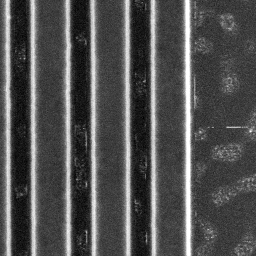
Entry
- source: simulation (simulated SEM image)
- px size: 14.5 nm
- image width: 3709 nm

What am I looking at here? parallel lines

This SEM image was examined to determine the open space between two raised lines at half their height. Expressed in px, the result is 24.3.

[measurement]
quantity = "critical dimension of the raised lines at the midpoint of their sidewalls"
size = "516 nanometers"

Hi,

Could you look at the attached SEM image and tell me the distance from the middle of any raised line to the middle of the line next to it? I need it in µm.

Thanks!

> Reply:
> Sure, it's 0.868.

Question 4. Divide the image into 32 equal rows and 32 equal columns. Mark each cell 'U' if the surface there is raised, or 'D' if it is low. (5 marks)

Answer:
UDDDUUUUDDDDUUUUDDDUUUUDDDDDDDDD
UDDDUUUUDDDDUUUUDDDUUUUDDDDDDDDD
UDDDUUUUDDDDUUUUDDDUUUUDDDDDDDDD
UDDDUUUUDDDDUUUUDDDUUUUDDDDDDDDD
UDDDUUUUDDDDUUUUDDDUUUUDDDDDDDDD
UDDDUUUUUDDDUUUUDDDUUUUDDDDDDDDD
UDDDUUUUUDDDUUUUDDDUUUUDDDDDDDDD
UDDDUUUUUDDDUUUUDDDUUUUDDDDDDDDD
UDDDUUUUUDDDUUUUDDDUUUUDDDDDDDDD
UDDDUUUUDDDDUUUUDDDUUUUDDDDDDDDD
UDDDUUUUDDDDUUUUDDDUUUUDDDDDDDDD
UDDDUUUUDDDDUUUUDDDUUUUDDDDDDDDD
UDDDUUUUDDDDUUUUDDDUUUUDDDDDDDDD
UDDDUUUUDDDDUUUUDDDUUUUDDDDDDDDD
UDDDUUUUDDDDUUUUDDDUUUUDDDDDDDDD
UDDDUUUUUDDDUUUUDDDUUUUDDDDDDDDD
UDDDUUUUUDDDUUUUDDDUUUUDDDDDDDDD
UDDDUUUUUDDDUUUUDDDUUUUDDDDDDDDD
UDDDUUUUUDDDUUUUDDDUUUUDDDDDDDDD
UDDDUUUUUDDDUUUUDDDUUUUDDDDDDDDD
UDDDUUUUUDDDUUUUDDDUUUUDDDDDDDDD
UDDDUUUUUDDDUUUUDDDUUUUDDDDDDDDD
UDDDUUUUUDDDUUUUDDDUUUUUDDDDDDDD
UDDDUUUUUDDDUUUUDDDUUUUUDDDDDDDD
UDDDUUUUUDDDUUUUDDDUUUUUDDDDDDDD
UDDDUUUUUDDDUUUUDDDUUUUUDDDDDDDD
UDDDUUUUUDDDUUUUDDDUUUUUDDDDDDDD
UDDDUUUUUDDDUUUUDDDUUUUUDDDDDDDD
UDDDUUUUUDDDUUUUDDDUUUUUDDDDDDDD
UDDDUUUUUDDDUUUUDDDUUUUUDDDDDDDD
UDDDUUUUUDDDUUUUDDDUUUUUDDDDDDDD
UDDDUUUUUDDDUUUUDDDUUUUUDDDDDDDD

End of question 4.